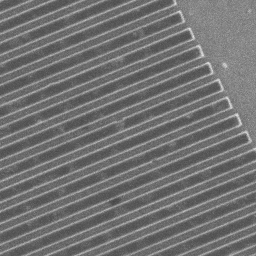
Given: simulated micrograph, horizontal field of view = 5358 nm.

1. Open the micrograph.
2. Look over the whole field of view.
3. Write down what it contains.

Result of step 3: parallel lines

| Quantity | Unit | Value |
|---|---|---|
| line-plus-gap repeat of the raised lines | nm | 407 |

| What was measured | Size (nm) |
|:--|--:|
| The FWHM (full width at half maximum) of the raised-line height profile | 254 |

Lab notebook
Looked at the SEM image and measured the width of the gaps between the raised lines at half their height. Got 162 nm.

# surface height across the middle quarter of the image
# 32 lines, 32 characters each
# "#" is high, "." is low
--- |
###.....########......#######...
#.....########.....#######......
....#######.....########.....###
.########.....########.....#####
#######....########.....########
####.....########.....#######...
##....########.....########.....
....########.....#######......##
.########......#######.....#####
#######.....########.....#######
####......#######.....########..
##.....########.....########....
.....########.....#######......#
..########.....########.....####
#######......#######......######
#####......#######.....########.
##......########.....#######....
.....########.....########.....#
...########.....#######......###
########......#######.....######
######.....#######......########
###......#######.....########...
#.....#######......########.....
....#######.....########......##
.########.....########.....#####
######.....########......#######
####.....########.....########..
#......#######......#######.....
....########.....########.....##
..########.....#######.....#####
#######.....########.....#######
#####.....#######......#######..